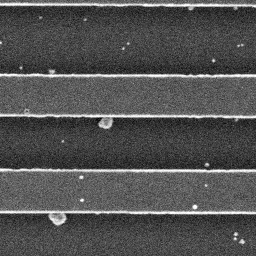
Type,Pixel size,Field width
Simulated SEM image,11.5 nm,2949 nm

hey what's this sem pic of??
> lines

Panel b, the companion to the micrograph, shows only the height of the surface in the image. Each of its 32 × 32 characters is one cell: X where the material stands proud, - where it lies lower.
XXXXXXXXXXXXXXXXXXXXXXXXXXXXXXXX
--------------------------------
--------------------------------
--------------------------------
--------------------------------
--------------------------------
--------------------------------
--------------------------------
--------------------------------
XXXXXXXXXXXXXXXXXXXXXXXXXXXXXXXX
XXXXXXXXXXXXXXXXXXXXXXXXXXXXXXXX
XXXXXXXXXXXXXXXXXXXXXXXXXXXXXXXX
XXXXXXXXXXXXXXXXXXXXXXXXXXXXXXXX
XXXXXXXXXXXXXXXXXXXXXXXXXXXXXXXX
----XX-X-XXXXXXXXXXXXXXXXXXXXXXX
--------------------------------
--------------------------------
--------------------------------
--------------------------------
--------------------------------
--------------------------------
XXXXXXXXXXXXXXXXXXXXXXXXXXXXXXXX
XXXXXXXXXXXXXXXXXXXXXXXXXXXXXXXX
XXXXXXXXXXXXXXXXXXXXXXXXXXXXXXXX
XXXXXXXXXXXXXXXXXXXXXXXXXXXXXXXX
XXXXXXXXXXXXXXXXXXXXXXXXXXXXXXXX
XXXXXXXXXXXXXXXXXXXXXXXXXXXXXXXX
--------------------------------
--------------------------------
--------------------------------
--------------------------------
--------------------------------